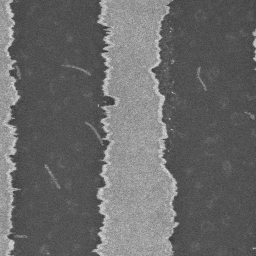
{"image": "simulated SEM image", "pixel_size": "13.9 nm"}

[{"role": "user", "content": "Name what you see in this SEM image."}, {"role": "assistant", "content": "one or a few lines or trenches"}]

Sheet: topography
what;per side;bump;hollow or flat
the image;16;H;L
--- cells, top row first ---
HLLLLLHHHHHLLLLL
HLLLLLLHHHLLLLLL
HLLLLLLHHHLLLLLL
HLLLLLLHHHLLLLLL
HLLLLLLHHHLLLLLL
HLLLLLLHHHLLLLLL
HLLLLLLHHHLLLLLL
HLLLLLLHHHLLLLLL
HLLLLLLHHHLLLLLL
HLLLLLLHHHLLLLLL
HLLLLLLHHHLLLLLL
HLLLLLLHHHHLLLLL
HLLLLLHHHHHLLLLL
HLLLLLLHHHHLLLLL
HLLLLLHHHHHLLLLL
HLLLLLHHHHHLLLLL